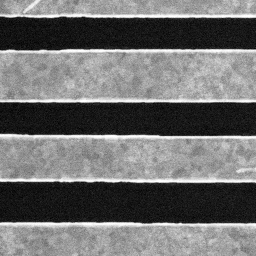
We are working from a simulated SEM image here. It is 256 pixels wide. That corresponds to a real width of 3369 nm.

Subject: lines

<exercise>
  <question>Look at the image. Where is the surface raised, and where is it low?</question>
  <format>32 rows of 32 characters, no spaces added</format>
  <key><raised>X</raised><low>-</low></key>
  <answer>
XXXXXXXXXXXXXXXXXXXXXXXXXXXXXXXX
XXXXXXXXXXXXXXXXXXXXXXXXXXXXXXXX
--------------------------------
--------------------------------
--------------------------------
--------------------------------
XXXXXXXXXXXXXXXXXXXXXXXXXXXXXXXX
XXXXXXXXXXXXXXXXXXXXXXXXXXXXXXXX
XXXXXXXXXXXXXXXXXXXXXXXXXXXXXXXX
XXXXXXXXXXXXXXXXXXXXXXXXXXXXXXXX
XXXXXXXXXXXXXXXXXXXXXXXXXXXXXXXX
XXXXXXXXXXXXXXXXXXXXXXXXXXXXXXXX
XXXXXXXXXXXXXXXXXXXXXXXXXXXXXXXX
--------------------------------
--------------------------------
--------------------------------
--------------------------------
XXXXXXXXXXXXXXXXXXXXXXXXXXXXXXXX
XXXXXXXXXXXXXXXXXXXXXXXXXXXXXXXX
XXXXXXXXXXXXXXXXXXXXXXXXXXXXXXXX
XXXXXXXXXXXXXXXXXXXXXXXXXXXXXXXX
XXXXXXXXXXXXXXXXXXXXXXXXXXXXXXXX
XXXXXXXXXXXXXXXXXXXXXXXXXXXXXXXX
--------------------------------
--------------------------------
--------------------------------
--------------------------------
--------------------------------
XXXXXXXXXXXXXXXXXXXXXXXXXXXXXXXX
XXXXXXXXXXXXXXXXXXXXXXXXXXXXXXXX
XXXXXXXXXXXXXXXXXXXXXXXXXXXXXXXX
XXXXXXXXXXXXXXXXXXXXXXXXXXXXXXXX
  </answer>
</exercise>